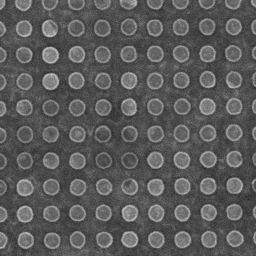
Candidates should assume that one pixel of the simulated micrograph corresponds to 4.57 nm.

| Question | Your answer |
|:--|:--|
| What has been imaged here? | a regular array of raised bodies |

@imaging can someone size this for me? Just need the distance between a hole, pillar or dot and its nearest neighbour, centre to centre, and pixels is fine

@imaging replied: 25.8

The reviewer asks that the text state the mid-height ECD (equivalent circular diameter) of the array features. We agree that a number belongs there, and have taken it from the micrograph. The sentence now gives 70.4 nm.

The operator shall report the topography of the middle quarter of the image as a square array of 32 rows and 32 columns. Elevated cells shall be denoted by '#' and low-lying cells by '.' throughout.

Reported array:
................................
................................
..##.....##....##.....#.....##..
.####...####...###...###....###.
.####...####..####...###....###.
..##....###....###...###....###.
................................
................................
................................
..##....###....###...###....###.
..###...####..####...####...###.
..###...####...###...####...###.
..##.....##....##.....##........
................................
................................
.............................#..
..###.#.###....###...####...###.
..###...###...####...####...###.
..###...###....###...####...###.
...#.....#......................
................................
................................
.........##....##.....##....###.
..###...####..####...####...###.
..###...####..####...####...###.
..###....##....###....##....###.
................................
................................
................................
..###....##....###...###....###.
..###...####...###...####...###.
..###...####...###...####...###.